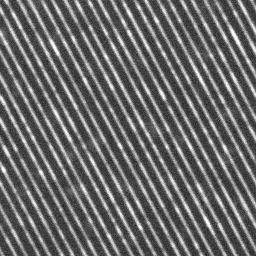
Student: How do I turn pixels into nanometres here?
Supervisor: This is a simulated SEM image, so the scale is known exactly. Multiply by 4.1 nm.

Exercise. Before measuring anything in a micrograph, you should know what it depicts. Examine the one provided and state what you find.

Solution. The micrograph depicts parallel lines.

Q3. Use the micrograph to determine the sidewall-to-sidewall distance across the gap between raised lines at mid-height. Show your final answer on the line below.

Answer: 32.9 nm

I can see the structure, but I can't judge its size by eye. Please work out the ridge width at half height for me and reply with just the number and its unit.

0.0081 micrometres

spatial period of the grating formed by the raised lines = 42 nm